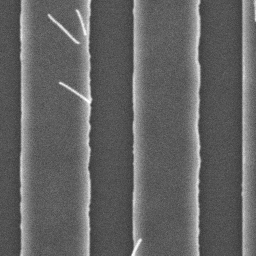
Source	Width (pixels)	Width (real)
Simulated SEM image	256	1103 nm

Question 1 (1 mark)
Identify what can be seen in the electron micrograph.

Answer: lines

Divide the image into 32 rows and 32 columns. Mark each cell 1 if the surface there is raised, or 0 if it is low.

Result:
00011111111000000111111110000011
00011111111000000111111110000011
00011111111000000111111110000011
00011111111000000111111110000011
00011111111000000111111110000011
00011111111000000111111110000011
00011111111000000111111110000011
00011111111000000111111110000011
00011111111000000111111110000011
00011111111000000111111110000011
00011111111000000111111110000011
00011111111000000111111110000011
00011111111000000111111110000011
00011111111000000111111110000011
00011111111000000111111110000011
00011111111000000111111110000011
00011111111000000111111110000011
00011111111000000111111110000011
00011111111000000111111110000011
00011111111000000111111110000011
00011111111000000111111110000011
00011111111000000111111110000011
00011111111000000111111110000011
00011111111000000111111110000011
00011111111000000111111110000011
00011111111000000111111110000011
00011111111000000111111110000011
00011111111000000111111110000011
00011111111000000111111110000011
00011111111000000111111110000011
00011111111000000111111110000011
00011111111000000111111110000011